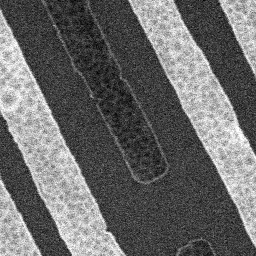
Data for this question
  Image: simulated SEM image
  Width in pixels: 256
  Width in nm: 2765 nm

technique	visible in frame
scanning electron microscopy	one or a few lines or trenches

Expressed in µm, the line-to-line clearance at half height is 0.445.